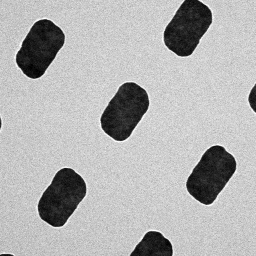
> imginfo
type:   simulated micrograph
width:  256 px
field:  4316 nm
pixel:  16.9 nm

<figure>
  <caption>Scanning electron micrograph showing holes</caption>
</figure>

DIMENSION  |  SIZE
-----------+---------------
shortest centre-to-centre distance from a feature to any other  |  1790 nanometers